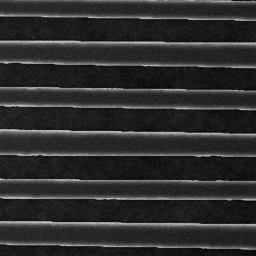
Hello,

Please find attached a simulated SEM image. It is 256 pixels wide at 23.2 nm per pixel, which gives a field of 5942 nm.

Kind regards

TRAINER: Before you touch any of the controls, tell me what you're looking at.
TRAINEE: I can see lines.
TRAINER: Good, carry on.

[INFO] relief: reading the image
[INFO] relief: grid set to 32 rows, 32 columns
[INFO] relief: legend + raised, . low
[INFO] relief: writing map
++++++++++++++++++++++++++++++++
++++++++++++++++++++++++++++++++
.............................+++
................................
................................
++++++++++++++++++++++++++++++++
++++++++++++++++++++++++++++++++
++++++++++++++++++++++++++++++++
................................
................................
................................
++++++++++++++++++++++++++++++++
++++++++++++++++++++++++++++++++
......................++++++++++
................................
................................
++++++++++++++..................
++++++++++++++++++++++++++++++++
++++++++++++++++++++++++++++++++
........................++++++++
................................
................................
++++++++++......................
++++++++++++++++++++++++++++++++
++++++++++++++++++++++++++++++++
................................
................................
................................
++++++++++++++++++++++++++++++++
++++++++++++++++++++++++++++++++
++++++++++++++++++++++++++++++++
................................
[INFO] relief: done